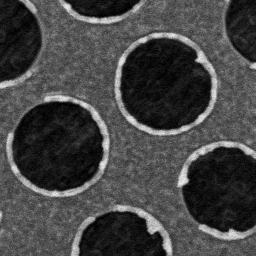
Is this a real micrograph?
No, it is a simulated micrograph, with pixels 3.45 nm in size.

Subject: holes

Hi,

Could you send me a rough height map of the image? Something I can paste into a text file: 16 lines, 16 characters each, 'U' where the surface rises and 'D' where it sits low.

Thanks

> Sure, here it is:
DDUUDDDDUUUUUUDD
DDUUUUUUUUUUUUDD
DDDUUUUUUDDUUUDD
DDUUUUUUDDDDUUUD
DDUUUUUUDDDDDUUU
UUUUUUUUDDDDDUUU
UUUDDUUUDDDDDUUU
UDDDDDUUUDDDUUUU
UDDDDDUUUUUUUUUU
UDDDDDUUUUUUUDDU
UDDDDDUUUUUUDDDD
UUDDDUUUUUUUDDDD
UUUUUUUUUUUDDDDD
UUUUUUDDDUUUDDDD
UUUUUDDDDDUUUUUU
UUUUUDDDDDUUUUUU